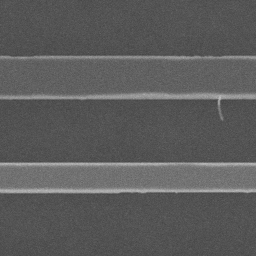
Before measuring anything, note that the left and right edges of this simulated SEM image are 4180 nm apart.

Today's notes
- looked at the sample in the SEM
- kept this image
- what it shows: lines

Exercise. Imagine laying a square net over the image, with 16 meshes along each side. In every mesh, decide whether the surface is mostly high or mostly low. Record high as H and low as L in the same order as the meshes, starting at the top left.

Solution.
LLLLLLLLLLLLLLLL
LLLLLLLLLLLLLLLL
LLLLLLLLLLLLLLLL
LLLLLLLLLLLLLLLL
HHHHHHHHHHHHHHHH
HHHHHHHHHHHHHHHH
LLLLLLLLLLLLLLLL
LLLLLLLLLLLLLLLL
LLLLLLLLLLLLLLLL
LLLLLLLLLLLLLLLL
HHHHHHHHHHHHHHHH
HHHHHHHHHHHHHHHH
LLLLLLLLLLLLLLLL
LLLLLLLLLLLLLLLL
LLLLLLLLLLLLLLLL
LLLLLLLLLLLLLLLL